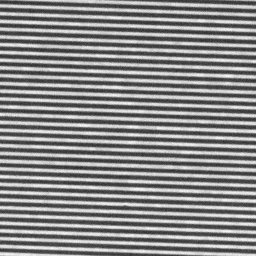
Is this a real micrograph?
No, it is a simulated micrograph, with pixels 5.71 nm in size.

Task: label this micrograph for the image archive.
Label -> parallel lines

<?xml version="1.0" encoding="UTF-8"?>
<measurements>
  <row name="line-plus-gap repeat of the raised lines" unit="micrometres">0.0442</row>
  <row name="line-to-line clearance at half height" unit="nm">32.8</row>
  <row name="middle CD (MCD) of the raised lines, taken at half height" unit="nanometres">12.8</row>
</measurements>